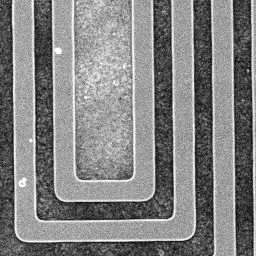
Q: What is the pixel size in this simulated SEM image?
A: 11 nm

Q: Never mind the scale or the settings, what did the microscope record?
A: groups of lines, slits or small figures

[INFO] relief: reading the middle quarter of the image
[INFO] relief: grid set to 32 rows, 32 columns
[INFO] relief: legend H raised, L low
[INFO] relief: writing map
HHLLLLLLLLLLLLLLLHHHHHLLLLLHHHHH
HHLLLLLLLLLLLLLLLHHHHHLLLLLHHHHH
HHLLLLLLLLLLLLLLLHHHHHLLLLLHHHHH
HHLLLLLLLLLLLLLLLHHHHHLLLLLHHHHH
HHLLLLLLLLLLLLLLLHHHHHLLLLLHHHHH
HHLLLLLLLLLLLLLLLHHHHHLLLLLHHHHH
HHLLLLLLLLLLLLLLLHHHHHLLLLLHHHHH
HHLLLLLLLLLLLLLLLHHHHHLLLLLHHHHH
HHLLLLLLLLLLLLLLLHHHHHLLLLLHHHHH
HHLLLLLLLLLLLLLLLHHHHHLLLLLHHHHH
HHHLLLLLLLLLLLLLLHHHHHLLLLLHHHHH
HHHLLLLLLLLLLLLLLHHHHHLLLLLHHHHH
HHHLLLLLLLLLLLLLLHHHHHLLLLLHHHHH
HHHLLLLLLLLLLLLLLHHHHHLLLLLHHHHH
HHHLLLLLLLLLLLLLLHHHHHLLLLLHHHHH
HHHLLLLLLLLLLLLLLLHHHHLLLLLHHHHH
HHHLLLLLLLLLLLLLLLHHHHLLLLLLHHHH
HHHLLLLLLLLLLLLLLLHHHHLLLLLLHHHH
HHHLLLLLLLLLLLLLLLHHHHLLLLLLHHHH
HHHLLLLLLLLLLLLLLHHHHHLLLLLLHHHH
HHHLLLLLLLLLLLLLLHHHHHLLLLLLHHHH
HHHLLLLLLLLLLLLLLLHHHHLLLLLLHHHH
HHHLLLLLLLLLLLLLLLHHHHLLLLLLHHHH
HHHLLLLLLLLLLLLLLLHHHHHLLLLLHHHH
HHHLLLLLLLLLLLLLLLHHHHHLLLLLHHHH
HHHLLLLLLLLLLLLLLLHHHHHLLLLLHHHH
HHHLLLLLLLLLLLLLLLHHHHHLLLLLHHHH
HHHLLLLLLLLLLLLLLHHHHHHLLLLLHHHH
HHHLLLLLLLLLLLLLLHHHHHHLLLLLHHHH
HHHHHHHHHHHHHHHHHHHHHHHLLLLLHHHH
HHHHHHHHHHHHHHHHHHHHHHHLLLLLHHHH
HHHHHHHHHHHHHHHHHHHHHHHLLLLLHHHH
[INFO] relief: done